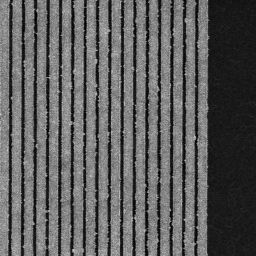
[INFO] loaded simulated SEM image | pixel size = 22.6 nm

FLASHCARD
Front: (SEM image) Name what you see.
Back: parallel lines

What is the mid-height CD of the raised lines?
195 nm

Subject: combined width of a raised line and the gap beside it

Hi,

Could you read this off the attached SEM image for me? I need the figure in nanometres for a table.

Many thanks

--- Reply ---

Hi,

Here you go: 280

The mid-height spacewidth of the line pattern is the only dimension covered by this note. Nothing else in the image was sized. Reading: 87.6 nanometres